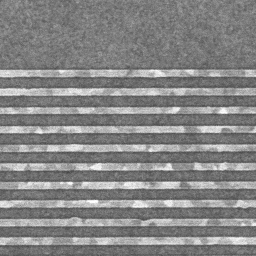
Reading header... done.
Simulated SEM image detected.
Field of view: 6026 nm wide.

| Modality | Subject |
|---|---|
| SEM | parallel lines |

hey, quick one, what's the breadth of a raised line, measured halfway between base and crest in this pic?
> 138 nanometers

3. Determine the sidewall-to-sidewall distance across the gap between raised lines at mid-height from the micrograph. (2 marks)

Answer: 297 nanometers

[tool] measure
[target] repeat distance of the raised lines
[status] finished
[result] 0.439 um